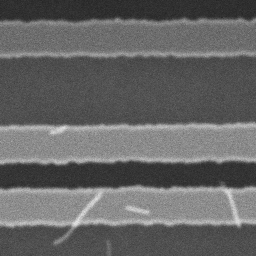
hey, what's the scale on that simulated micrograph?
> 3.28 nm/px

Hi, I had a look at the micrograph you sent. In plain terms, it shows lines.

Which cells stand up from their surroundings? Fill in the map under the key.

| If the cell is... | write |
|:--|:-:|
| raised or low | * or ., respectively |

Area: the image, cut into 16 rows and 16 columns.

................
****************
****************
**..*.*....**...
................
................
................
................
****************
****************
................
................
****************
****************
................
................